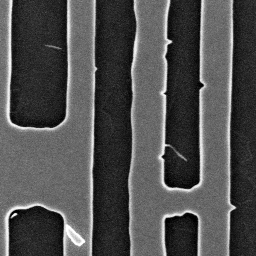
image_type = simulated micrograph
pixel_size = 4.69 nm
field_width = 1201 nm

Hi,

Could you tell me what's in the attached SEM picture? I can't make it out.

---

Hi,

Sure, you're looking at one or a few lines or trenches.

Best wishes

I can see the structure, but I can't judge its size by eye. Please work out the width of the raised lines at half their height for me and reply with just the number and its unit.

145 nm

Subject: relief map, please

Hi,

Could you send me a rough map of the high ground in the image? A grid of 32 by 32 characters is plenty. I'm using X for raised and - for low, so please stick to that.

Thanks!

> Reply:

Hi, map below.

X--------XXX-----XXXX----XXXX---
X--------XXX-----XXXX----XXXX---
X--------XXX-----XXXX----XXXX---
X-------XXXX-----XXXX----XXXX---
X--------XXX-----XXXX----XXXX---
X--------XXX-----XXXX----XXXX---
X--------XXX-----XXXX----XXXX---
X--------XXX-----XXXX----XXXX---
X--------XXX-----XXXX----XXXX---
X--------XXX----XXXXX----XXXX---
X-------XXXX-----XXXX----XXXX---
X-------XXXX-----XXXX----XXXX---
X-------XXXX-----XXXX----XXXX---
X-------XXXX----XXXXX----XXXX---
X-------XXXX----XXXXX----XXXX---
XX-----XXXXX----XXXX-----XXXX---
XXXXXXXXXXXX-----XXX-----XXXX---
XXXXXXXXXXXX-----XXX-----XXXX---
XXXXXXXXXXXX-----XXX-----XXXX---
XXXXXXXXXXXX----XXXX-----XXXX---
XXXXXXXXXXX-----XXXX-----XXXX---
XXXXXXXXXXX-----XXXX-----XXXX---
XXXXXXXXXXX-----XXXX-----XXXX---
XXXXXXXXXXXX----XXXXX---XXXXX---
XXXXXXXXXXXX----XXXXXXXXXXXXX---
XXXXXXXXXXX-----XXXXXXXXXXXXX---
XX-----XXXX-----XXXXXXXXXXXXX---
X-------XXX-----XXXXX----XXXX---
X-------XXX-----XXXX-----XXXX---
X-------XXX-----XXXX-----XXXX---
X-------XXX-----XXXX-----XXXX---
X-------XXX-----XXXXX----XXXX---